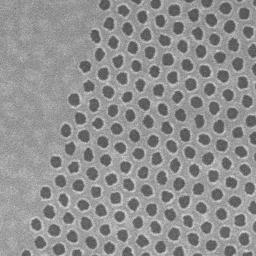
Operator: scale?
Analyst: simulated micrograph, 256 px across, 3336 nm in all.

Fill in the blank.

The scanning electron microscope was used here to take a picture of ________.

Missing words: a regular array of holes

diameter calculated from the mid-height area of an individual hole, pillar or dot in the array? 168 nanometres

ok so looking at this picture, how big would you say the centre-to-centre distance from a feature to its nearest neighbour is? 239 nanometres